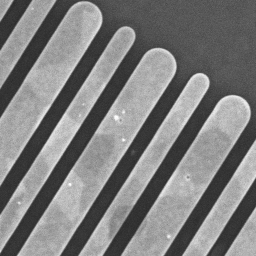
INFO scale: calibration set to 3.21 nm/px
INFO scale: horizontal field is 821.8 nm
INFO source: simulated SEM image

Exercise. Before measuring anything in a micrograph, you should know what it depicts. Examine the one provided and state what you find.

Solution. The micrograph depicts groups of lines, slits or small figures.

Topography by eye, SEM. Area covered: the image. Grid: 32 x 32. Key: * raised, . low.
*...***..***....................
*..***..*****...................
...**...*****...................
..***..*****...*................
.***...*****..***...............
.***..*****..****...............
***..******..***..***...........
**...*****..***...****..........
**..*****...***..*****..........
*..******..***..******..**......
...*****..***...*****..***......
..******..***..*****...***......
.******..***..******..***...***.
.*****..***...*****...**...****.
******..***..*****...***..*****.
*****..***...*****..***...*****.
****...***..*****...***..*****..
****..***..******..***..******..
***..***...*****..***...*****..*
**...***..*****...***..*****...*
**..***..******..***..******..**
*...**...*****..***...*****..***
...***..*****...***..*****...***
..***...*****..***..******..***.
..**...*****..****..*****..****.
.***..******..***..******..***..
***...*****..***...*****..***...
***..*****...***..*****...***..*
**..******..***..******..***..**
*...*****..***...*****..***...**
*..*****...***..*****...***..***
..******..***..******..***..****